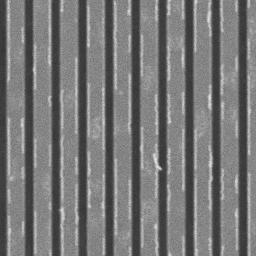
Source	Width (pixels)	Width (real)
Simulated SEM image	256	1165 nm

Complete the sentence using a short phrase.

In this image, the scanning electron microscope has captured parallel lines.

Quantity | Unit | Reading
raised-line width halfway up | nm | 85.3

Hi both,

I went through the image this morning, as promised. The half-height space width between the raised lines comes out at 38.1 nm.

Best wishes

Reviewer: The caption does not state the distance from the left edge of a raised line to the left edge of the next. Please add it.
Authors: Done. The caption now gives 122 nanometres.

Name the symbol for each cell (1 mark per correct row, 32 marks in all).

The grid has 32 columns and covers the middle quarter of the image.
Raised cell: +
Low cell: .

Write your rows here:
+++...++++...++++..+++++..++++..
+++...++++..+++++..+++++..++++..
+++...++++..+++++..+++++..++++..
+++...++++..+++++..+++++..++++..
+++...++++..+++++..+++++..++++..
+++...++++..+++++..+++++..++++..
+++...++++..+++++..+++++..++++..
+++...++++..+++++..+++++..++++..
+++...++++..+++++..+++++..++++..
+++...++++..+++++..+++++..++++..
+++...++++..+++++..+++++..++++..
+++...++++..+++++..+++++..++++..
+++...++++..+++++..+++++..++++..
+++...++++..+++++..+++++..++++..
+++...++++..+++++..+++++..++++..
+++...++++..+++++..+++++..++++..
+++...++++..+++++..+++++..++++..
+++...++++..+++++..+++++..++++..
++++..++++...++++..+++++..++++..
+++...++++...++++..+++++..++++..
+++...++++..+++++..+++++..++++..
+++...++++..+++++..+++++..++++..
+++...++++..+++++..+++++..++++..
+++...++++..+++++..+++++..++++..
+++...++++..+++++..+++++..++++..
+++...++++..+++++..+++++..++++..
+++...++++..+++++..+++++..++++..
+++...++++..+++++..+++++..++++..
+++...++++...++++..+++++..++++..
+++...++++...++++..+++++..++++..
+++...++++..+++++..+++++..++++..
+++...++++..+++++..+++++..++++..